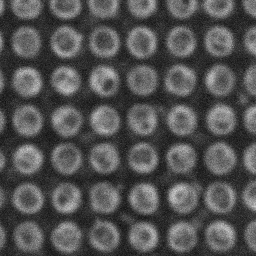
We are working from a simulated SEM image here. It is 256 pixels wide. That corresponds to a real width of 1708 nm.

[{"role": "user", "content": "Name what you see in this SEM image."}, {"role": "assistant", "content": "a regular array of raised bodies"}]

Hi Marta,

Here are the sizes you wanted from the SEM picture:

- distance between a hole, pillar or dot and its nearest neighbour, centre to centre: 252 nm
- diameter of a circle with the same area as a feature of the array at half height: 169 nm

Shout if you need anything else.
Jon